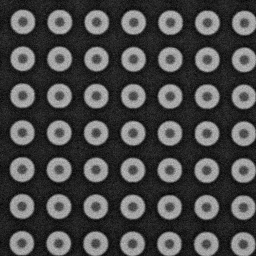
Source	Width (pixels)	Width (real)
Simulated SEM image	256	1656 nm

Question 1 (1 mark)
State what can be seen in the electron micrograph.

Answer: an array of small figures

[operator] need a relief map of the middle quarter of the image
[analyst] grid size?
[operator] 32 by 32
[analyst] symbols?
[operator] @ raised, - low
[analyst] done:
@-----@@@@@----@@@@@----@@@@@---
-------@@@------@@@------@@@----
--------------------------------
--------------------------------
--------------------------------
@-----@@@@------@@@------@@@----
@----@@@@@@----@@@@@----@@@@@---
@@---@@@@@@---@@@@@@----@@@@@---
@@---@@@@@@---@@@@@@----@@@@@---
@----@@@@@@----@@@@@----@@@@@---
@-----@@@@------@@@------@@@----
--------------------------------
--------------------------------
--------------------------------
-------@@-------@@-------@@@----
@-----@@@@-----@@@@@----@@@@@---
@@---@@@@@@---@@@@@@----@@@@@---
@@---@@@@@@---@@@@@@----@@@@@---
@@---@@@@@@----@@@@@----@@@@@---
@-----@@@@-----@@@@-----@@@@@---
--------------------------------
--------------------------------
--------------------------------
--------------------------------
@-----@@@@-----@@@@@----@@@@@---
@@---@@@@@@---@@@@@@----@@@@@---
@@---@@@@@@---@@@@@@----@@@@@---
@@---@@@@@@---@@@@@@----@@@@@---
@-----@@@@-----@@@@@----@@@@@---
--------------------------------
--------------------------------
--------------------------------